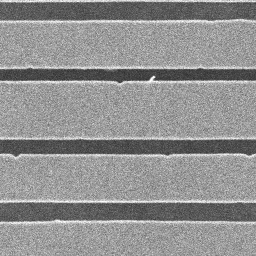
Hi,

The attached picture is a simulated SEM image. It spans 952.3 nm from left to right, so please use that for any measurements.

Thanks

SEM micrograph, one or a few lines or trenches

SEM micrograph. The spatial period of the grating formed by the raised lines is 250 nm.